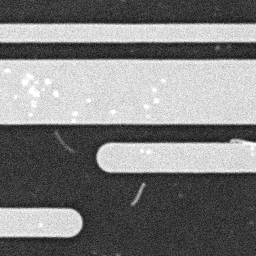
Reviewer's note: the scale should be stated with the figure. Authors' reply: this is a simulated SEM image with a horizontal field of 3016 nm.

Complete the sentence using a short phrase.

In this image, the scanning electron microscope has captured groups of lines, slits or small figures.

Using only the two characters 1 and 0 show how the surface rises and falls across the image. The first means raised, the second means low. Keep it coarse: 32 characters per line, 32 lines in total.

00000000000000000000000000000000
00000000000000000000000000000000
00000000000000000000000000000000
11111111111111111111111111111111
11111111111111111111111111111111
00000000000000000000000000000000
00000000000000000000000000000000
00001000000000000000000000000000
11111111111111111111111111111111
11111111111111111111111111111111
11111111111111111111111111111111
11111111111111111111111111111111
11111111111111111111111111111111
11111111111111111111111111111111
11111111111111111111111111111111
00000000000000000000000000000000
00000000000000000000000000000000
00000000000000000000000000000000
00000000000001111111111111111111
00000000000011111111111111111111
00000000000011111111111111111111
00000000000000000000000000000000
00000000000000000000000000000000
00000000000000000000000000000000
00000000000000000000000000000000
00000000000000000000000000000000
11111111100000000000000000000000
11111111110000000000000000000000
11111111110000000000000000000000
11111111100000000000000000000000
00000000000000000000000000000000
00000000000000000000000000000000